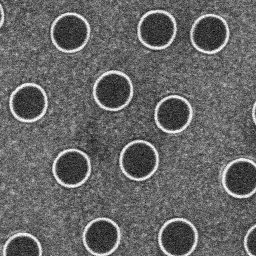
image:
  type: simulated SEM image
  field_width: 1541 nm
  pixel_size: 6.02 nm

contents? a regular array of raised bodies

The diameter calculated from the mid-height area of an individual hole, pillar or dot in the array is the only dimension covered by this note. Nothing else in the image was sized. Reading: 38 px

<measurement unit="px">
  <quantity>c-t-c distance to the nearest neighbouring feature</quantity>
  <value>60.9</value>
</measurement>